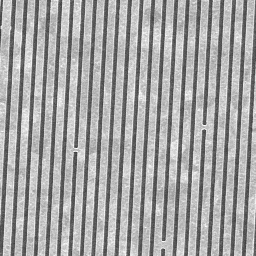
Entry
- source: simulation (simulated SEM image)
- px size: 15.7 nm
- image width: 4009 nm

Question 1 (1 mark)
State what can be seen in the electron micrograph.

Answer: parallel lines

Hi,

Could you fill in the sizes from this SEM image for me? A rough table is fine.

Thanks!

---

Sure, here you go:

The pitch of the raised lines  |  181 nm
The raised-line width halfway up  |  0.11 um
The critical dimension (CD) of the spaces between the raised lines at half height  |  74.3 nm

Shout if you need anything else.